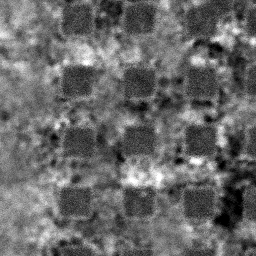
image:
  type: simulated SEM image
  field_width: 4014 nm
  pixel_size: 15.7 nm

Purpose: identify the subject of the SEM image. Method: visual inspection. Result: a regular array of raised bodies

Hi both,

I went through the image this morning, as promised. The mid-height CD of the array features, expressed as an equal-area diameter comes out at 37.7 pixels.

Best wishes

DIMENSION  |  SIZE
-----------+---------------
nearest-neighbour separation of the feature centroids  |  0.931 um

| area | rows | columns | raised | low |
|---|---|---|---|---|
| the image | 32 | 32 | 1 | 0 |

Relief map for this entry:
00000000111000001110000001111000
00000000111100011111000111111001
00000000111100011111000111110001
00000000111100011110000111100001
00000000111000001100000111100001
00000000000000000000000000000000
00000000000000000000000000000000
00000000000000000000000000000000
00000000111100001110000111100001
00000000111100011111000111100001
00000001111100011111000111100001
00000001111100011111000111100001
00000000000000000000000000000000
00000000000000000000000000000000
00000000000000000000000000000000
00000001000000000000000000100000
00000000111100011111000111100001
00000000111100011111000111100001
00000000111100011111000111100001
00000000111100001110000111100001
00000000000000000000000000000000
00000000000000000000000000000000
00000000000000000000000000000000
00000000111000001110000111100000
00000001111100011111000111100001
00000001111100011110000111100011
00000001111000011110000111100001
00000000000000000000000110000001
00000000000000000000000000000000
00000000000000000000000000000000
00000000000000000000000000000000
00000000111100011110000111100001